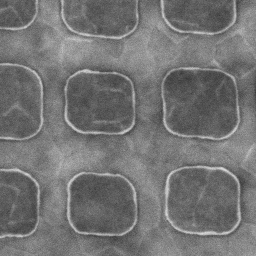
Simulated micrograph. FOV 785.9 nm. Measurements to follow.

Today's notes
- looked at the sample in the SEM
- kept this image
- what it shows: raised bodies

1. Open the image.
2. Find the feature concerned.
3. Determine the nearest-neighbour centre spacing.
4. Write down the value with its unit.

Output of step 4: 303 nanometers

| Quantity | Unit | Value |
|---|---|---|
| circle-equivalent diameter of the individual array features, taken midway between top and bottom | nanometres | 225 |